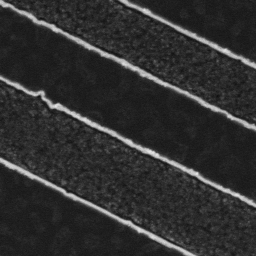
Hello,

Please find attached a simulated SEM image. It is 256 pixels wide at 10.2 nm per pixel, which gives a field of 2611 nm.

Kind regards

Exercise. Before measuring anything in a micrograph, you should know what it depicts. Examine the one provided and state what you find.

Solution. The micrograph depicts one or a few lines or trenches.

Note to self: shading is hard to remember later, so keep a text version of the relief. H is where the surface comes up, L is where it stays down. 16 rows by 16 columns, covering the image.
HLLLLLLLLHHHHHHH
HHHLLLLLLLLHHHHH
HHHHHLLLLLLLLHHH
HHHHHHHLLLLLLLLH
HHHHHHHHHLLLLLLL
LHHHHHHHHHHLLLLL
LLLHHHHHHHHHHLLL
LLLLLHHHHHHHHHHL
LLLLLLLHHHHHHHHH
LLLLLLLLLHHHHHHH
HLLLLLLLLLLHHHHH
HHHLLLLLLLLLLHHH
HHHHHLLLLLLLLLLH
HHHHHHHLLLLLLLLL
HHHHHHHHHLLLLLLL
HHHHHHHHHHHLLLLL